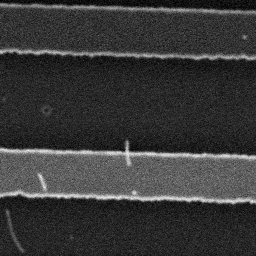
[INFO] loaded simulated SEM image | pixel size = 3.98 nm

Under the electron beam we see lines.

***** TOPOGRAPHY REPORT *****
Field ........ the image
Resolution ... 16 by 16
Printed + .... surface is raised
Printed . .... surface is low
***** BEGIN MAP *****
++++++++........
++++++++++++++++
++++++++++++++++
.........+++++++
................
................
................
................
................
++++++..........
++++++++++++++++
++++++++++++++++
............++++
................
................
................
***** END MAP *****